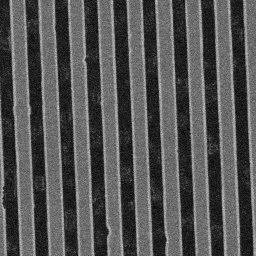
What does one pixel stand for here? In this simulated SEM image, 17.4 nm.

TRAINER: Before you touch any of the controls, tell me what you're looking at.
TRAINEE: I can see parallel lines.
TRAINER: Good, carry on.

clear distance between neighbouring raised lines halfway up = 0.264 um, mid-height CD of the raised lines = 246 nanometres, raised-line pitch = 509 nanometres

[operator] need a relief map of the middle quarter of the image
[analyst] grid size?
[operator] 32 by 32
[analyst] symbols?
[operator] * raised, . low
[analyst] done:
..***....****....***....***....*
..***....****....***....***....*
..***....****....***....***....*
..***....****....***....****...*
..***....****....***....***....*
..****....***....***....***....*
..****....***....***....****....
..****....***....***....****....
..****....***....***....****....
..****...****....***....****....
..****....***....***....****....
..****....***....***....****....
..****....***....***....****....
...***....***....****...****....
...***....***....****...****....
...***....***....****...****....
...***....***....****...****....
...***....***....****...****....
...***....***....****...****....
...***....***....****....***....
...***....***....****....***....
...***....***.....***....***....
...***....***.....***....***....
...***....***.....***....***....
...***....***.....***....***....
...***....***.....***....***....
...***....***.....***....***....
...***....****....***....***....
...***....****....***....***....
...****....***....***....***....
...****....***....***....****...
...****....***....***....****...